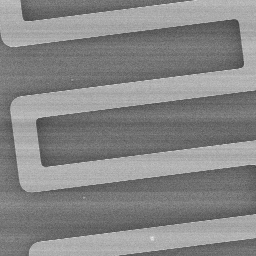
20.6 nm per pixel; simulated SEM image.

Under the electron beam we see groups of lines, slits or small figures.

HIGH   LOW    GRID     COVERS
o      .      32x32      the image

ooo..................ooooooooooo
ooo..........ooooooooooooooooooo
ooo..ooooooooooooooooooooooo.ooo
ooooooooooooooooooooo.........oo
ooooooooooooo.................oo
.oooo.........................oo
..............................oo
..............................oo
..............................oo
.......................ooooooooo
...............ooooooooooooooooo
.......ooooooooooooooooooooooo..
..oooooooooooooooooooo..........
.ooooooooooooo..................
.oooooo.........................
.ooo............................
..ooo...........................
..ooo...........................
..ooo....................ooooooo
..ooo............ooooooooooooooo
..ooo....ooooooooooooooooooooooo
..oooooooooooooooooooooo........
..oooooooooooooo................
...ooooo........................
................................
................................
................................
..........................oooooo
...................ooooooooooooo
...........ooooooooooooooooooooo
....oooooooooooooooooooooo......
....oooooooooooooo..............